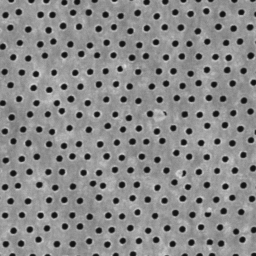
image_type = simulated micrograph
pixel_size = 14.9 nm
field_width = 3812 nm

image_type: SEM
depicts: a regular array of holes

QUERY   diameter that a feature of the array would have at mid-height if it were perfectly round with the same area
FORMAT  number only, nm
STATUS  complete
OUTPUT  95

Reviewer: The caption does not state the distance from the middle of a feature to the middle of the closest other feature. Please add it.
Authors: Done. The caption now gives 210 nm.